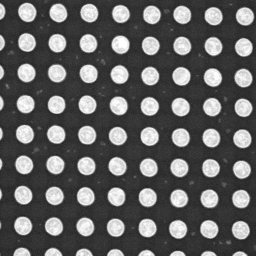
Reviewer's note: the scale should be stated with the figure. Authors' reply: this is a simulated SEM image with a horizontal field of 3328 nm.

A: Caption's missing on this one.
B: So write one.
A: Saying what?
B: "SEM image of a regular array of raised bodies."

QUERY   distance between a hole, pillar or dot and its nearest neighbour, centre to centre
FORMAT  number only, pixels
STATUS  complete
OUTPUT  30.3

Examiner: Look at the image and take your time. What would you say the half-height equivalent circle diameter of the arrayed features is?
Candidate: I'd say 0.233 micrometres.